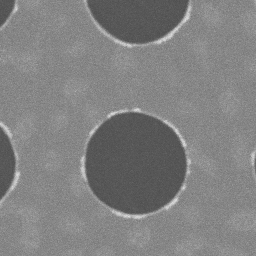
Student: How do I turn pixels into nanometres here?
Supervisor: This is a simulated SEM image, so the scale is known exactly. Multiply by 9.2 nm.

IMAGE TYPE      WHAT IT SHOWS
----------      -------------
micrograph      holes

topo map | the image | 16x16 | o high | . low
.ooooo......oooo
oooooo.....ooooo
ooooooo...oooooo
oooooooooooooooo
oooooooooooooooo
oooooooooooooooo
oooooooooooooooo
ooooooo...oooooo
oooooo.....ooooo
.oooo.......oooo
.oooo.......oooo
.ooooo.....ooooo
oooooo.....ooooo
oooooooooooooooo
oooooooooooooooo
oooooooooooooooo